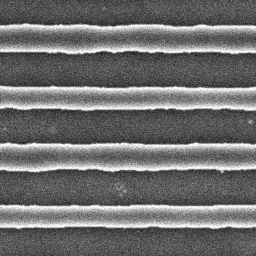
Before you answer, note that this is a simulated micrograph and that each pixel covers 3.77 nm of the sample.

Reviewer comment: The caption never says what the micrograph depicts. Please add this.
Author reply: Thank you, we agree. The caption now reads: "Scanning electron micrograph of lines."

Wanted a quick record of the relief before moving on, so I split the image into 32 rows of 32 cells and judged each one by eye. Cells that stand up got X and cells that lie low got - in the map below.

--------------------------------
--------------------------------
--------------------------------
XXXXXXXXXXXXXXXXXXXXXXXXXXXXXXXX
XXXXXXXXXXXXXXXXXXXXXXXXXXXXXXXX
XXXXXXXXXXXXXXXXXXXXXXXXXXXXXXXX
------XXXXXX--X---XXXXXX---XXXXX
--------------------------------
--------------------------------
--------------------------------
--------------------------------
XXXXXXXXXXXXXXXXXXXXXXXXXXXXXXXX
XXXXXXXXXXXXXXXXXXXXXXXXXXXXXXXX
--XX---XXXXXXXXXXXXXX-XXX-XXXXXX
--------------------------------
--------------------------------
--------------------------------
--------------------------------
XXXXXXXXXXXXXXXXXXXXXXXXXXXXXXXX
XXXXXXXXXXXXXXXXXXXXXXXXXXXXXXXX
XXXXXXXXXXXXXXXXXXXXXXXXXXXXXXXX
--------------------------------
--------------------------------
--------------------------------
--------------------------------
--------------------------------
XXXXXXXXXXXXXXXXXXXXXXXXXXXXXXXX
XXXXXXXXXXXXXXXXXXXXXXXXXXXXXXXX
--------------------------------
--------------------------------
--------------------------------
--------------------------------